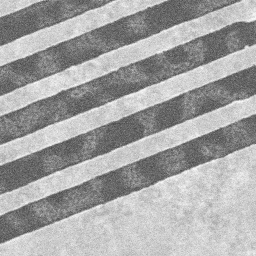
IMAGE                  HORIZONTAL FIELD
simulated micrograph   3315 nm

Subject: parallel lines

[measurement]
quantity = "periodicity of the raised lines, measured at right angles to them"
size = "598 nanometers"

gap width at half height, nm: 370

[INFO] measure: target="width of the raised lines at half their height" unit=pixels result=18.1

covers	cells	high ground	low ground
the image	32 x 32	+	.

++++.........+++++++.........+++
++.........++++++..........+++++
.........+++++..........++++++++
......++++++..........++++++....
...+++++++.........++++++.......
.++++++..........++++++.........
++++..........++++++..........++
++..........++++++.........+++++
.........++++++..........++++++.
.......+++++..........++++++....
....++++++..........++++++......
..+++++..........++++++.........
+++++..........++++++..........+
++..........++++++..........++++
..........++++++.........++++++.
.......++++++..........++++++...
.....++++++.........++++++......
..++++++..........++++++........
+++++..........++++++..........+
+++..........+++++..........++++
..........++++++.........+++++++
.......++++++..........+++++++++
.....++++++..........+++++++++++
..+++++++.........++++++++++++++
++++++..........++++++++++++++++
+++..........+++++++++++++++++++
+.........++++++++++++++++++++++
........++++++++++++++++++++++++
.....+++++++++++++++++++++++++++
...+++++++++++++++++++++++++++++
++++++++++++++++++++++++++++++++
++++++++++++++++++++++++++++++++